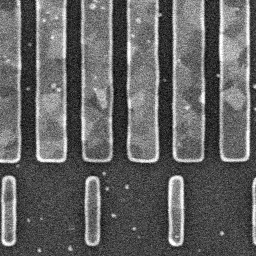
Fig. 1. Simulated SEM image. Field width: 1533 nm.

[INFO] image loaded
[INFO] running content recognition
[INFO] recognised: wiring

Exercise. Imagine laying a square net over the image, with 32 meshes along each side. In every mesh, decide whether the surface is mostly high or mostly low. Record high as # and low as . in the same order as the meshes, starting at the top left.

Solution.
##...###..####..####..###...###.
##...###..####..####..###...###.
##...###..####..####..###...###.
##...###..####..####..###...###.
##...###..####..####..###...###.
##...###..####..####..###...###.
##...###..####..####..###...###.
##...###..####..####..###...###.
##...###..####..####..###...###.
##...###..####..####..###...###.
##...###..####..####..###...###.
##...###..####..####..###...###.
##...###..####..####..###...###.
##...###..####..####..###...###.
##...###..####..####..###...###.
##...###..####..####..###...###.
##...###..####..####..###...###.
##...###..####..####..###...###.
##...###..####..####..###...###.
##...###..####..####..###...###.
................................
................................
.#.........#..........#.........
##.........#.........##.........
##.........#.........##.........
##.........#.........##.........
##.........#.........##.........
##.........#.........##.........
##.........#.........##.........
##.........#.........##.........
................................
................................